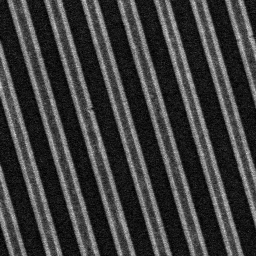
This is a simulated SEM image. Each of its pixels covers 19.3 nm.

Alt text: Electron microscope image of parallel lines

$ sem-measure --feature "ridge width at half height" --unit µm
0.245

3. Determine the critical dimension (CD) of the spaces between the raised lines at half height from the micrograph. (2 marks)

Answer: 421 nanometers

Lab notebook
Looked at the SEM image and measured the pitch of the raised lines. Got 671 nm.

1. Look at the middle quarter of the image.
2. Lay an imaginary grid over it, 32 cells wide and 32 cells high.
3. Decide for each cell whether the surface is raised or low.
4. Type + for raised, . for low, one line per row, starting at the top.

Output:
++++.....++++.....++++......+++.
.+++......+++......+++......+++.
.+++......+++......+++......+++.
.++++.....++++.....++++.....++++
.++++......+++......+++......+++
..+++......+++......+++......+++
..+++......+++......++++.....+++
..++++.....++++.....++++......++
...+++......+++......+++......++
...+++......+++......++++.....++
...++++.....++++.....++++......+
...++++......+++......+++......+
....+++......+++......+++......+
....+++......+++......++++.....+
....++++.....++++.....++++......
.....+++......+++......+++......
.....+++......+++......++++.....
.....++++.....++++.....++++.....
.....++++......+++......+++.....
......+++......+++......+++.....
+.....+++......+++......++++....
+.....++++......+++......+++....
+......+++......+++......+++....
+......+++......+++......++++...
++.....++++.....++++.....++++...
++.....++++......+++......+++...
++......+++......+++......+++...
+++.....++++.....++++.....++++..
+++.....++++......+++......+++..
+++......+++......+++......+++..
+++......+++......+++......++++.
++++.....++++.....++++.....++++.